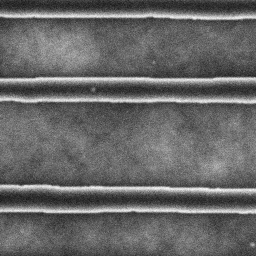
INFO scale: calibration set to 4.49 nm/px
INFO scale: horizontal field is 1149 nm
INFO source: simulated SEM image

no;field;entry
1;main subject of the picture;lines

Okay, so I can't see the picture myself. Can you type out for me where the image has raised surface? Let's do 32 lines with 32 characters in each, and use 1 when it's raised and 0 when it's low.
11111111111111111111111111111111
11111111111111111111111111111111
00000000000000000000000000000000
00000000000000000000000000000000
00000000000000000000000000000000
00000000000000000000000000000000
00000000000000000000000000000000
00000000000000000000000000000000
00000000000000000000000000000000
00000000000000000000000000000000
11111111111111111111111111111111
11111111111111111111111111111111
01111111111111111111111111111111
00000000000000000000000000000000
00000000000000000000000000000000
00000000000000000000000000000000
00000000000000000000000000000000
00000000000000000000000000000000
00000000000000000000000000000000
00000000000000000000000000000000
00000000000000000000000000000000
00000000000000000000000000000000
00000000000000000000000000000000
11111111111111111111110000000000
11111111111111111111111111111111
11111111111111111111111111111111
00000000000000000000000000000111
00000000000000000000000000000000
00000000000000000000000000000000
00000000000000000000000000000000
00000000000000000000000000000000
00000000000000000000000000000000